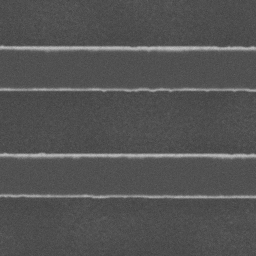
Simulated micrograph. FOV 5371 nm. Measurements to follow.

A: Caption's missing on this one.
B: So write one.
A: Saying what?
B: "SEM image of lines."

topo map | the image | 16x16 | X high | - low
----------------
----------------
----------------
XXXXXXXXXXXXXXXX
XXXXXXXXXXXXXXXX
XXXXXXXXXXXXXXXX
----------------
----------------
----------------
----------------
XXXXXXXXXXXXXXXX
XXXXXXXXXXXXXXXX
----------------
----------------
----------------
----------------